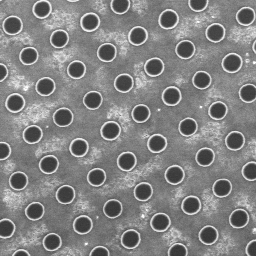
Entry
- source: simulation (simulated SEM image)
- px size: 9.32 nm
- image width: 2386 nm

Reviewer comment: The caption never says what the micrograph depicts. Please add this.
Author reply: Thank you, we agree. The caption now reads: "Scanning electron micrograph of a regular array of raised bodies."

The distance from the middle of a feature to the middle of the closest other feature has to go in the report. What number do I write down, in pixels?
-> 34.4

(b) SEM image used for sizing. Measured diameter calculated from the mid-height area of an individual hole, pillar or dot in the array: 18.5 px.